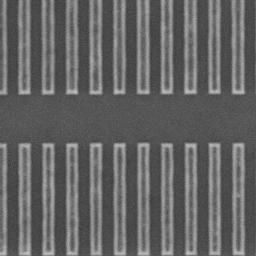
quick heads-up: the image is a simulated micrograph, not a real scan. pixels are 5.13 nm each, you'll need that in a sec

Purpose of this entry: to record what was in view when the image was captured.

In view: wiring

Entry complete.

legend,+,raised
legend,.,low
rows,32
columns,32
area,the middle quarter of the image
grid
.++....++....++....++....++....+
.++....++....++....++....++....+
.++....++....++....++....++....+
.++....++....++....++....++....+
.++....++....++....++....++....+
.++....++....++....++....++....+
.++....++....++....++....++....+
................................
................................
................................
................................
................................
................................
................................
................................
................................
................................
................................
................................
................................
.++....++....++....++....++....+
.++....++....++....++....++....+
.++....++....++....++....++....+
.++....++....++....++....++....+
.++....++....++....++....++....+
.++....++....++....++....++....+
.++....++....++....++....++....+
.++....++....++....++....++....+
.++....++....++....++....++....+
.++....++....++....++....++....+
.++....++....++....++....++....+
.++....++....++....++....++....+